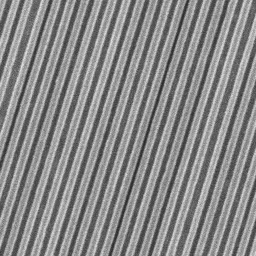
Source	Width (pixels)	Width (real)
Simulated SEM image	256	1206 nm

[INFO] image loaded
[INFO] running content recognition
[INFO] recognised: parallel lines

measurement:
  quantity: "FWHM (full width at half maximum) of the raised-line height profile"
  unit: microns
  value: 0.0316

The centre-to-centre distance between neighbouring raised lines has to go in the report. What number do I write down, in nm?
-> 61.7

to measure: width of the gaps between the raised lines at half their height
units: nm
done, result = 27